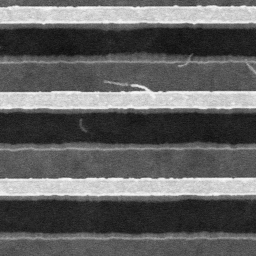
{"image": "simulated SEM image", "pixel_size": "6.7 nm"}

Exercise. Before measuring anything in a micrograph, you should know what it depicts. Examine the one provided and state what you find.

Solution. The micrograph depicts lines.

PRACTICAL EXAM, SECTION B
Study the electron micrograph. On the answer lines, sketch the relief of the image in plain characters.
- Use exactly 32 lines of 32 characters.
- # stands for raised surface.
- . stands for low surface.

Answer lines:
################################
################################
################################
................................
................................
................................
................................
.............#...#.....#......#.
################################
################################
################################
################################
################################
################################
................................
................................
................................
................................
...#..#.###.....#...##.#########
################################
################################
################################
################################
################################
#####..################..###....
................................
................................
................................
................................
................................
################################
################################